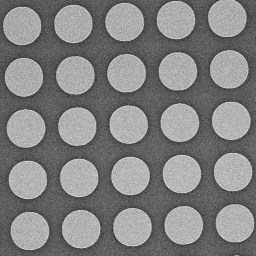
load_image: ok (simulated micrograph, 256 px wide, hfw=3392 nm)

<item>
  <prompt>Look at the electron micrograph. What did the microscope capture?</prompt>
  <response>an array of small figures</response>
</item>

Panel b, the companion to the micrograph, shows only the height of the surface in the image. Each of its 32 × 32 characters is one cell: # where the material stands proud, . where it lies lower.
...............#.....##....###..
.###...####...####..####..#####.
.####..####..#####..####..#####.
#####..####..#####..####..####..
.####..####...###....##.....#...
..#.............................
............................##..
..##....###...###...####...####.
.####..#####..####..#####.#####.
.####..#####.#####..#####.#####.
.####..#####..####...###...###..
..##....##......................
................................
.........#.....##....###...####.
.####...####..####..#####..####.
.#####.#####..####..#####..####.
.#####.#####..####..#####..####.
.####...###....##....##.........
................................
......................#.....##..
..###...###....###...####..####.
.#####..####..#####.#####..####.
.#####..####..#####.#####..####.
.#####..####..####...###....##..
..###....#......................
................................
.........##....###...####..####.
..####..####..#####..####..#####
.#####..#####.#####..####..#####
.#####..####..#####..####...###.
..###....###...###..............
................................